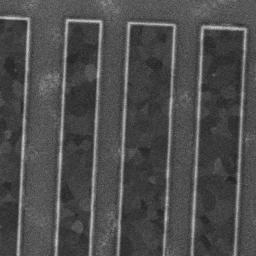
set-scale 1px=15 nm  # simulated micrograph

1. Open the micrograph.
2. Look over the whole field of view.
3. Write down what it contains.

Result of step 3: one or a few lines or trenches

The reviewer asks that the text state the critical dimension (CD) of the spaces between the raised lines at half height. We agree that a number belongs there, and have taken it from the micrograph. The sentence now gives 422 nm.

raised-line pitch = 1050 nanometers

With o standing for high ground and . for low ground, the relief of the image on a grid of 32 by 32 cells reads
................................
................................
ooo.............................
oooo....ooooo...oooooo....ooo...
oooo....ooooo...oooooo...oooooo.
ooo.....oooo....oooooo...oooooo.
ooo.....oooo....oooooo...oooooo.
ooo.....oooo....oooooo...ooooo..
ooo.....oooo....oooooo...ooooo..
ooo.....oooo....ooooo....ooooo..
ooo.....oooo....ooooo....ooooo..
ooo.....oooo....ooooo....ooooo..
ooo.....oooo....ooooo....ooooo..
ooo.....oooo....ooooo....ooooo..
ooo.....oooo....ooooo....ooooo..
ooo.....oooo....ooooo....ooooo..
ooo.....oooo...oooooo....ooooo..
ooo.....oooo...oooooo....ooooo..
ooo.....oooo...oooooo....ooooo..
ooo.....oooo...oooooo....ooooo..
ooo.....oooo...oooooo....ooooo..
ooo.....oooo...oooooo....ooooo..
ooo....ooooo...oooooo...oooooo..
ooo....ooooo...oooooo...oooooo..
ooo....ooooo...oooooo...oooooo..
ooo....ooooo...oooooo...oooooo..
oo.....ooooo...oooooo...oooooo..
oo.....oooo....oooooo...oooooo..
oo.....oooo....oooooo...oooooo..
oo.....oooo....oooooo...ooooo...
oo.....oooo....ooooo....ooooo...
oo.....oooo....ooooo....ooooo...